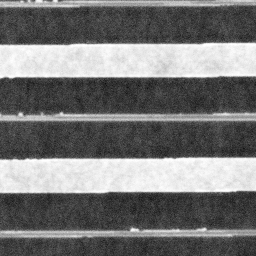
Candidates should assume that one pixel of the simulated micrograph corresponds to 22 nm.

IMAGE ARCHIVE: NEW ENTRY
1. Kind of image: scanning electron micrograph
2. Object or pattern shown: lines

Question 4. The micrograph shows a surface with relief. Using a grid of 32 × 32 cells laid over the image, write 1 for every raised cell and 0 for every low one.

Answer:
00000000000000000000000000000000
00000000000000000000000000000000
00000000000000000000000000000000
00000000000000000000000000000000
00000000000000000000000000000000
00000000000000000000000000000000
11111111111111111111111111111111
11111111111111111111111111111111
11111111111111111111111111111111
11111111111111111111111111100000
00000000000000000000000000000000
00000000000000000000000000000000
00000000000000000000000000000000
00000000000000000000000000000000
00000000000000000000000000000000
00000000000000000000000000000000
00000000000000000000000000000000
00000000000000000000000000000000
00000000000000000000000000000000
00000000000000000000000000000000
11111111111111111111111111111111
11111111111111111111111111111111
11111111111111111111111111111111
11111111111111111111111111111111
00000000000000000000000000000000
00000000000000000000000000000000
00000000000000000000000000000000
00000000000000000000000000000000
00000000000000000000000000000000
11101100000000000000000000000000
00000000000000000000000000000000
00000000000000000000000000000000